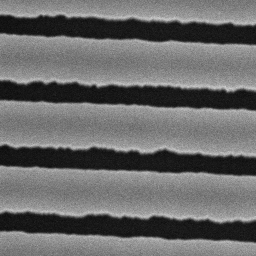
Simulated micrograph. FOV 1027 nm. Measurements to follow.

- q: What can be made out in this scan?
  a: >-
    lines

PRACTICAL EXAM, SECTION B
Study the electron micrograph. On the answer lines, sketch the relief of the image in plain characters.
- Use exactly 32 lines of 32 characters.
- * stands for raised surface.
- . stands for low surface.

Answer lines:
********************************
********************************
..................**************
................................
*****..*........................
**************************......
********************************
********************************
********************************
********************************
..........**********************
................................
................................
************************.*......
********************************
********************************
********************************
********************************
.....*.****.********************
.............................***
................................
*******************.............
********************************
********************************
********************************
********************************
********************************
........................*.******
................................
*************...................
********************************
********************************